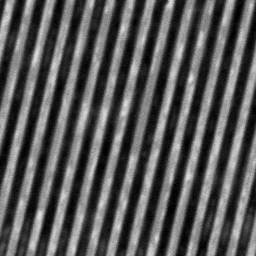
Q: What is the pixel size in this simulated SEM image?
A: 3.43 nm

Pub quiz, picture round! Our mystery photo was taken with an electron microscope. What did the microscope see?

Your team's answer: parallel lines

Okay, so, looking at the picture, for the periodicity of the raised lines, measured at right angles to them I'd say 66.9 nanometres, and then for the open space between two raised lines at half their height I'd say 41.3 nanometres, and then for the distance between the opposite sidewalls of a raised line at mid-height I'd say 26.8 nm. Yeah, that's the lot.